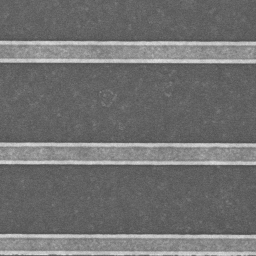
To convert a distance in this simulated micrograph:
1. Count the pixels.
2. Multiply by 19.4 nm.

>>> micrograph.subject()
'one or a few lines or trenches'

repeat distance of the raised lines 1870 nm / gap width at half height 1.54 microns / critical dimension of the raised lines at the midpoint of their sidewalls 0.34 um